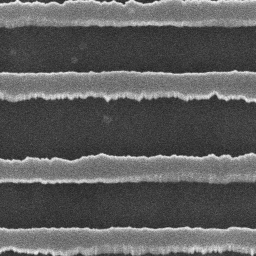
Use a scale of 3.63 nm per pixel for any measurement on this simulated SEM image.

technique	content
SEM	lines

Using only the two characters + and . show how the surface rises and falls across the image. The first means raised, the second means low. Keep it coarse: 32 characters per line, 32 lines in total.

.+++++++++++++++++++++++++++++++
++++++++++++++++++++++++++++++++
++++++++++++++++++++++++++++++++
................................
................................
................................
................................
................................
................................
++++++++++++++++++++++++++++++++
++++++++++++++++++++++++++++++++
++++++++++++++++++++++++++++++++
...............................+
................................
................................
................................
................................
................................
................................
............++.....+.+....+.+.++
++++++++++++++++++++++++++++++++
++++++++++++++++++++++++++++++++
++++++++++++++++...........++...
................................
................................
................................
................................
................................
................+......+........
++++++++++++++++++++++++++++++++
++++++++++++++++++++++++++++++++
....+++++.++.....+.............+